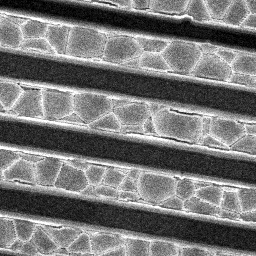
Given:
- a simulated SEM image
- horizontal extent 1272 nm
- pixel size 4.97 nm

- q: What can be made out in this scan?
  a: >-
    one or a few lines or trenches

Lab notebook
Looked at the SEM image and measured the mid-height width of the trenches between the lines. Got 132 nanometres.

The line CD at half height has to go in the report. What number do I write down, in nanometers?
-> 199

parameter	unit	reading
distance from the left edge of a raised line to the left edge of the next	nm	332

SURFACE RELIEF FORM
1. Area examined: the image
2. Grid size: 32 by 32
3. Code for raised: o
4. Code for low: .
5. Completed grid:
..........oooooooooooooooooooooo
ooo.............oooooooooooooooo
oooooooo................oooooooo
oooooooooooooo..............oooo
oooooooooooooooooooo............
ooooooooooooooooooooooooooo.....
...ooooooooooooooooooooooooooooo
.........ooooooooooooooooooooooo
...............ooooooooooooooooo
.....................ooooooooooo
oooooo.....................ooooo
oooooooooooo....................
oooooooooooooooooo..............
oooooooooooooooooooooooo........
ooooooooooooooooooooooooooooo...
.....ooooooooooooooooooooooooooo
...........ooooooooooooooooooooo
.................ooooooooooooooo
ooo.....................oooooooo
ooooooooo.....................oo
ooooooooooooooo.................
ooooooooooooooooooooo...........
ooooooooooooooooooooooooooo.....
...ooooooooooooooooooooooooooooo
.........ooooooooooooooooooooooo
...............ooooooooooooooooo
.....................ooooooooooo
oooooo....................oooooo
oooooooooooo....................
oooooooooooooooooo..............
oooooooooooooooooooooooo........
.ooooooooooooooooooooooooooooo..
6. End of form